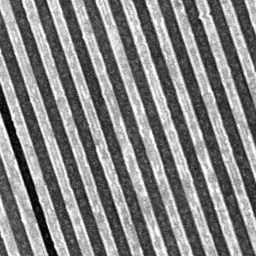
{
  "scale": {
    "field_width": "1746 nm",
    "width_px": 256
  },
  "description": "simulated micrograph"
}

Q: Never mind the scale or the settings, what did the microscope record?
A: parallel lines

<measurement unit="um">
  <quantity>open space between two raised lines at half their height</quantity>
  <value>0.0865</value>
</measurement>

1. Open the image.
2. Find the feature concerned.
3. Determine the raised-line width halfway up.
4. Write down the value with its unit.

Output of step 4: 73.5 nm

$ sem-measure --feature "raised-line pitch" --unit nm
159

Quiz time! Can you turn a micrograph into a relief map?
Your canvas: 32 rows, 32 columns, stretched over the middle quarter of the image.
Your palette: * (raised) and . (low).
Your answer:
.***...***...***....***...***...
..**....**....***...***...***...
..***...***...***...***....**...
..***...***...***....***...***..
...**....***...***...***...***..
...***...***...***...***....**..
...***...***...***....***...***.
....**....***...***...***...***.
*...***...***...***...***...***.
*...***...***....**....**....***
*....**....***...***...***...***
**...***...***...***...***...***
**...***...***....**....***...**
**....**....**....***...***...**
***...***...***...***...***....*
***...***...***....**....***...*
***....**....**....***...***...*
.***...***...***...***...***....
.***...***...***....**....***...
.***....**....**....***...***...
..***...***...***...***...***...
..***...***...***...***....***..
..***...***....***...***...***..
...***...***...***...***....**..
...***...***...***....**....***.
...***....**....***...***...***.
....***...***...***...***...***.
*...***...***...***....**....***
*...***....**....**....***...***
*....***...***...***...***...***
**...***...***...***....**....**
**...***....**....***...***...**